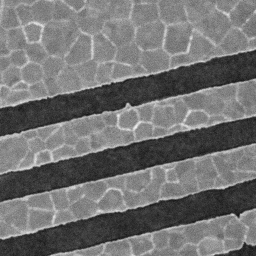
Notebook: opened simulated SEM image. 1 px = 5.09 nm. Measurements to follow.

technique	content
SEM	one or a few lines or trenches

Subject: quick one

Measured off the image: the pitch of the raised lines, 325 nm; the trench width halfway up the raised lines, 145 nm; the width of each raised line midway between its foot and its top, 0.178 µm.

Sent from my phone